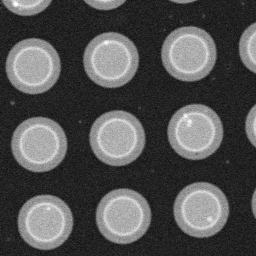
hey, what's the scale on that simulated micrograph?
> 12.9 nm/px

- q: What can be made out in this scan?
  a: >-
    an array of small figures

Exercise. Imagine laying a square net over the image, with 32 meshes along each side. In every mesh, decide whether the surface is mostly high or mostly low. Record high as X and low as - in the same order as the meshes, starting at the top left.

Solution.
-XXXXX-----XXXX-----------------
--XXX---------------------------
--------------------------------
-----------------------XX------X
------------XXXX-----XXXXX----XX
--XXXX-----XXXXXX---XXXXXXX---XX
-XXXXXX----XXXXXX---XXXXXXX---XX
-XXXXXX---XXXXXXX---XXXXXXX---XX
-XXXXXXX---XXXXXX----XXXXXX----X
-XXXXXX----XXXXXX-----XXXX------
-XXXXXX-----XXXX----------------
---XX---------------------------
--------------------------------
-----------------------XXX------
-------------XXXX-----XXXXX----X
---XXXX-----XXXXXX---XXXXXXX---X
--XXXXXX---XXXXXXX---XXXXXXX---X
-XXXXXXX---XXXXXXX---XXXXXXX---X
-XXXXXXX---XXXXXXX----XXXXX-----
--XXXXXX----XXXXX------XXX------
--XXXXX------XXX----------------
--------------------------------
--------------------------------
-----------------------XXXX-----
-----XX------XXXXX----XXXXXX----
---XXXXX----XXXXXX----XXXXXXX--X
--XXXXXXX---XXXXXXX---XXXXXXX---
--XXXXXXX---XXXXXXX---XXXXXX----
--XXXXXXX---XXXXXX----XXXXXX----
---XXXXXX----XXXXX------XX------
----XXXX------------------------
--------------------------------